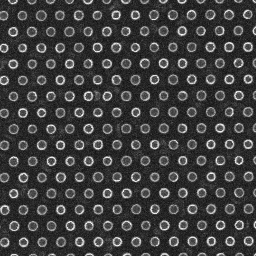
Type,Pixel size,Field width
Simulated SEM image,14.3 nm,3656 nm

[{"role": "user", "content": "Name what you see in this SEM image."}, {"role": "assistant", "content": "a regular array of raised bodies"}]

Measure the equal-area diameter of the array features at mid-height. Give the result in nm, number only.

133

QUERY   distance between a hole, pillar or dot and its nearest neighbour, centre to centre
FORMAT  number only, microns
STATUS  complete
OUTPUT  0.262